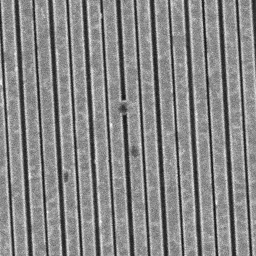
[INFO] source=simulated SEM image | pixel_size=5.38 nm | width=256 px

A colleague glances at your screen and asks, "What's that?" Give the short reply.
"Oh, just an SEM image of parallel lines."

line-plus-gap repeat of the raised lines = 91.4 nanometers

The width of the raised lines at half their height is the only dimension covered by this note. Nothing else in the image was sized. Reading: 70.5 nanometres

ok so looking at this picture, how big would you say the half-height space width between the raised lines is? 24.9 nm